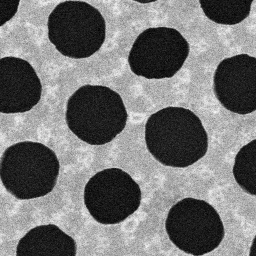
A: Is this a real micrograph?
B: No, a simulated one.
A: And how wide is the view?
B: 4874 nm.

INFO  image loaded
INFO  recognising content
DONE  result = holes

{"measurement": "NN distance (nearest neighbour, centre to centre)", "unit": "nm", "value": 1580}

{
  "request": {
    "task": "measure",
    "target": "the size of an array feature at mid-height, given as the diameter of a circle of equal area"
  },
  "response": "58.3 px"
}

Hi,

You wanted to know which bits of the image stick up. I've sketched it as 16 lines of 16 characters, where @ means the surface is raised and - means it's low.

-@@---@@@@@@@---
@@@----@@@@@@@-@
@@@---@@----@@@@
@@@@--@@----@@@-
--@@@@@@---@@---
---@@--@@@@@@---
--@@----@@@@@@--
@@@@----@---@@@@
@@@@@--@@----@@@
---@@@@@@----@@-
----@@@@@@@@@@@-
---@@----@@@@@@-
@@@@@----@@--@@@
@@@@@@--@@----@@
@@--@@@@@@----@@
@----@@@@@@--@@@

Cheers